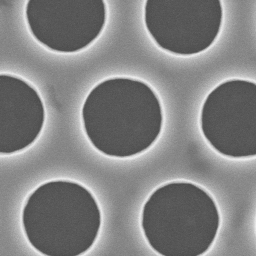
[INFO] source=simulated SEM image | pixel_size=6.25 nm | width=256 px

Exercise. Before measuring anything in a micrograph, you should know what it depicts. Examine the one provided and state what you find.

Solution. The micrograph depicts holes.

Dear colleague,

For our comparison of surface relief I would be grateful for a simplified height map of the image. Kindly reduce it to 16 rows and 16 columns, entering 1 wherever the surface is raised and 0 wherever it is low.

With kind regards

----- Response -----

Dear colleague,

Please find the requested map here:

1100000110000011
1100000110000011
1100001111000111
1111111111111111
1111111111111111
0011110001111000
0001100000111000
0001100000111000
0011100000111000
0111110001111100
1111111111111111
1110011111001111
1100001110000111
1000001110000011
1100001110000011
1100001111000111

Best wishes